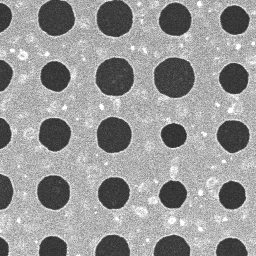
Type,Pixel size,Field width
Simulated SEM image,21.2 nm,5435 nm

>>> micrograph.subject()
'a regular array of holes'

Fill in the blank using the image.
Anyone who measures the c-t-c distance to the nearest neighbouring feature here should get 1230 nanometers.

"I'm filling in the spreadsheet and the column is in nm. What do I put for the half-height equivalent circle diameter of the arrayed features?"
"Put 691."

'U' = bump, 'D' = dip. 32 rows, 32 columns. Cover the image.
DUUUUDDDDUUUUDDDUUUUUDDUUUUUUUUU
DUUUUDDDDUUUDDDDDUUUDDDDUUUUDDDU
DUUUUDDDDUUUDDDDDUUUDDDDUUUUDDDU
DUUUUDDDDUUUDDDDUUUUDDDDUUUUDDDU
UUUUUUUUUUUUUUDUUUUUUUUUUUUUUUUU
UUUUUUUUUUUUUUUUUUUUUUUUUUUUUUUU
UUUUUUUUUUUUUUUUUUUUUUUUUUUUUUUU
UUUUUUUUUUUUUDDDUUUUUDDUUUUUUUUU
DUUUUDDDUUUUDDDDUUUDDDDDUUUUDDDU
DDUUUDDDDUUUDDDDDUUDDDDDUUUDDDDU
DUUUUDDDDUUUDDDDDUUDDDDDUUUUDDDU
UUUUUUUUUUUUUDDDUUUUDDDDUUUUDDUU
UUUUUUUUUUUUUUUUUUUUUUUUUUUUUUUU
UUUUUUUUUUUUUUUUUUUUUUUUUUUUUUUU
UUUUUUUUUUUUUUUUUUUUUUUUUUUUUUUU
DUUUUDDDUUUUUDDDUUUUUDUUUUUUDDDU
DUUUUDDDDUUUDDDDUUUUDDDUUUUDDDDU
DUUUUDDDDUUUDDDDUUUUDDDUUUUDDDDU
UUUUUUDDUUUUUDDDUUUUUUUUUUUUDDUU
UUUUUUUUUUUUUUUUUUUUUUUUUUUUUUUU
UUUUUUUUUUUUUUUUUUUUUUUUUUUUUUUU
UUUUUUUUUUUUUUUUUUUUUUUUUUUUUUUU
DUUUUDDDUUUUUDDUUUUUUUUUUUUUUUUU
DDUUUDDDDUUUDDDDUUUUDDDUUUUUDDUU
DDUUUDDDDUUUDDDDUUUUDDDUUUUDDDDU
DUUUUDDDUUUUUDDDUUUUDDDUUUUUDDUU
UUUUUUUUUUUUUUUUUUUUUUUUUUUUUUUU
UUUUUUUUUUUUUUUUUUUUUUUUUUUUUUUU
UUUUUUUUUUUUUUUUUUUUUUUUUUUUUUUU
UUUUUUDUUUUUUDDUUUUUUDUUUUUUUUUU
DUUUUDDDUUUUDDDDUUUUDDDUUUUDDDUU
DUUUUDDDUUUUDDDDUUUDDDDDUUUDDDDU